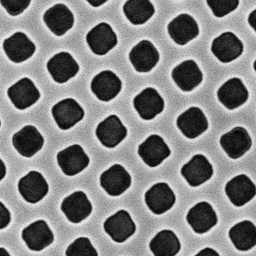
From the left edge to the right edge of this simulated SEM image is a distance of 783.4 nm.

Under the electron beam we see a regular array of holes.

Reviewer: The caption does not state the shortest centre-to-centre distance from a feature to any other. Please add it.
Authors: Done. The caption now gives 142 nanometers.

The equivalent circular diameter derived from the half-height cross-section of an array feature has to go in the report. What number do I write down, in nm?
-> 93.9